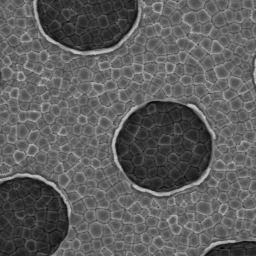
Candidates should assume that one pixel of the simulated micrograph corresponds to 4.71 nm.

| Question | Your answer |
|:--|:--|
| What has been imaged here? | holes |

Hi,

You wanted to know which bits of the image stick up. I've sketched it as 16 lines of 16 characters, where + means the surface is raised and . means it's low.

++.......+++++++
+++.....++++++++
+++.....++++++++
++++++++++++++++
++++++++++++++++
++++++++++++++++
+++++++++..+++++
++++++++.....+++
+++++++......+++
+++++++......+++
++++++++.....+++
...+++++....++++
....++++++++++++
....++++++++++++
....++++++++++++
....+++++++++...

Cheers